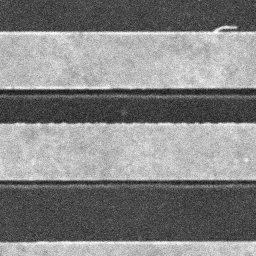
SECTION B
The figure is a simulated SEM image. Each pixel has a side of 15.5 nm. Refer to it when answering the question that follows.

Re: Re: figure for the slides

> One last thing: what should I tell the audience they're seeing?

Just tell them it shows lines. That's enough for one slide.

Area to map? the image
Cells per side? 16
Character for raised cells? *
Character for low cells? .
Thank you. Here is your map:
................
................
****************
****************
****************
*******.**......
................
................
****************
****************
****************
................
................
................
................
****************